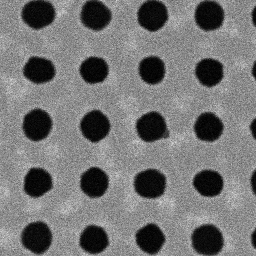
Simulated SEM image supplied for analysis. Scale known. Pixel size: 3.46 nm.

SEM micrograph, a regular array of holes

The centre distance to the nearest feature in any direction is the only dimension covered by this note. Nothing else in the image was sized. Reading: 192 nm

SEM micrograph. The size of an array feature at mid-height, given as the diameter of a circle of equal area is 98.5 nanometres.